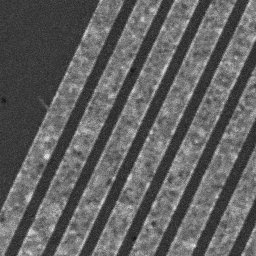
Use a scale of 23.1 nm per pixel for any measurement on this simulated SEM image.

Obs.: parallel lines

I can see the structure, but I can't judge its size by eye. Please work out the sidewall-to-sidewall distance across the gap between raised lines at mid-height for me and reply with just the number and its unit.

300 nm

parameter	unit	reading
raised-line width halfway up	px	20.9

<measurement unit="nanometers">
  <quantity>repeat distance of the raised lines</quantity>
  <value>779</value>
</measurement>